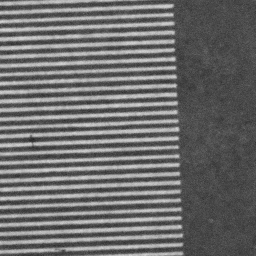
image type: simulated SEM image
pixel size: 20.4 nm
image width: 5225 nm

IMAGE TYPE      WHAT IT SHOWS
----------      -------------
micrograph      parallel lines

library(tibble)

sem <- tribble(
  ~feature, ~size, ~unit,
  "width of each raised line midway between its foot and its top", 2.75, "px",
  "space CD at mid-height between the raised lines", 0.127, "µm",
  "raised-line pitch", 181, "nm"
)